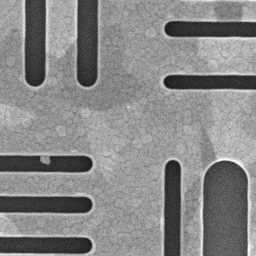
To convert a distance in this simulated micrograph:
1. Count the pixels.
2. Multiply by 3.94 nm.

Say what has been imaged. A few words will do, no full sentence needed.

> groups of lines, slits or small figures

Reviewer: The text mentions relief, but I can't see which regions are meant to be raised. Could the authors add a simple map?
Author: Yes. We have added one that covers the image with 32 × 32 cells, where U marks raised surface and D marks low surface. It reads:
UUUDDDUUUUDDUUUUUUUUUUUUUUUUUUUU
UUUDDDUUUUDDUUUUUUUUUUUUUUUUUUUU
UUUDDDUUUUDDUUUUUUUUUUUUUUUUUUUU
UUUDDDUUUUDDUUUUUUUUUDDDDDDDDDDD
UUUDDDUUUUDDUUUUUUUUUDDDDDDDDDDD
UUUDDDUUUUDDUUUUUUUUUUUUUUUUUUUU
UUUDDDUUUUDDUUUUUUUUUUUUUUUUUUUU
UUUDDDUUUUDDUUUUUUUUUUUUUUUUUUUU
UUUDDDUUUUDDUUUUUUUUUUUUUUUUUUUU
UUUDDDUUUUDDUUUUUUUUUDDDDDDDDDDD
UUUDDUUUUUDDUUUUUUUUDDDDDDDDDDDD
UUUUUUUUUUUUUUUUUUUUUUUUUUUUUUUU
UUUUUUUUUUUUUUUUUUUUUUUUUUUUUUUU
UUUUUUUUUUUUUUUUUUUUUUUUUUUUUUUU
UUUUUUUUUUUUUUUUUUUUUUUUUUUUUUUU
UUUUUUUUUUUUUUUUUUUUUUUUUUUUUUUU
UUUUUUUUUUUUUUUUUUUUUUUUUUUUUUUU
UUUUUUUUUUUUUUUUUUUUUUUUUUUUUUUU
UUUUUUUUUUUUUUUUUUUUUUUUUUUUUUUU
DDDDDDDDDDDUUUUUUUUUUUUUUUUUUUUU
DDDDDDDDDDDDUUUUUUUUUDUUUUUDDDUU
DDDDDDDDDDDUUUUUUUUUUDDUUUDDDDDU
UUUUUUUUUUUUUUUUUUUUDDDUUDDDDDDU
UUUUUUUUUUUUUUUUUUUUDDDUUDDDDDDU
DDDDDDDDDDUUUUUUUUUUDDDUUDDDDDDU
DDDDDDDDDDDDUUUUUUUUDDDUUDDDDDDU
DDDDDDDDDDDUUUUUUUUUDDDUUDDDDDDU
UUUUUUUUUUUUUUUUUUUUDDDUUDDDDDDU
UUUUUUUUUUUUUUUUUUUUDDDUUDDDDDDU
DDUUUUUUUUUUUUUUUUUUDDDUUDDDDDDU
DDDDDDDDDDDDUUUUUUUUDDDUUDDDDDDU
DDDDDDDDDDDUUUUUUUUUDDDUUDDDDDDU